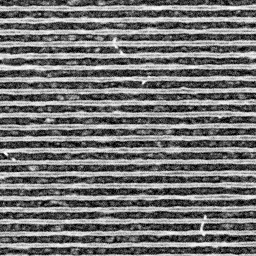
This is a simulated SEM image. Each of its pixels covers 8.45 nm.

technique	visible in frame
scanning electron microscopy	parallel lines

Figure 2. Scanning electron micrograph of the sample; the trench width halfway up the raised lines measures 66.5 nm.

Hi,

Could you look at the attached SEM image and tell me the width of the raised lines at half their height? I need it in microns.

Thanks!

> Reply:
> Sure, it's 0.0327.